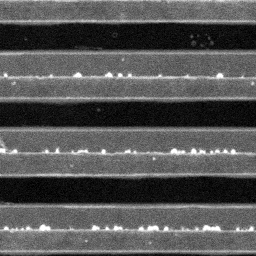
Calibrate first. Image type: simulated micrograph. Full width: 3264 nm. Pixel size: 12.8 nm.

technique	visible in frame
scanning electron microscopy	lines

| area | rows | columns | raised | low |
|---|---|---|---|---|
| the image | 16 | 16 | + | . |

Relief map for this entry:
++++++++++++++++
................
................
++++++++++++++++
++++++++++++++++
++++++++++++++++
................
................
++++++++++++++++
++++++++++++++++
++++++++++++++++
................
................
++++++++++++++++
++++++++++++++++
++++++++++++++++